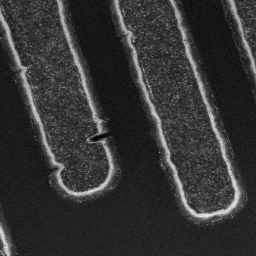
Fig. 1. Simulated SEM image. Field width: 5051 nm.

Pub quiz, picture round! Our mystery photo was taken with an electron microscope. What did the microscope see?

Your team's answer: one or a few lines or trenches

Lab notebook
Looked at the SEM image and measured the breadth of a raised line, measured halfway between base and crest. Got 1050 nm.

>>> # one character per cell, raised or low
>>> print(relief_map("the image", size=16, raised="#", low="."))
####...####....#
####....###....#
.###....####...#
.####...####....
.####....###....
..###....####...
..####...####...
..####....###...
...###....####..
...####...####..
....###....###..
....##.....####.
............###.
................
................
................